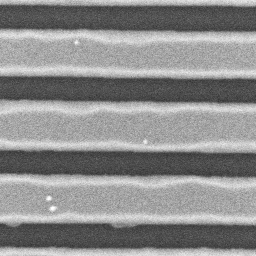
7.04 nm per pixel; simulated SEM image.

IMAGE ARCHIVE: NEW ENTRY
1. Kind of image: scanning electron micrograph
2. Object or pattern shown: lines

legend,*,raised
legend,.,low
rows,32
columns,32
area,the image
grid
.............................***
................................
................................
................................
********************************
********************************
********************************
********************************
********************************
.......................*********
................................
................................
................................
********************************
********************************
********************************
********************************
********************************
......*******.******************
................................
................................
................................
*****************************..*
********************************
********************************
********************************
********************************
********************************
................................
................................
................................
********************************